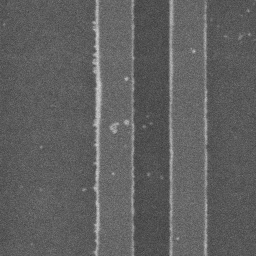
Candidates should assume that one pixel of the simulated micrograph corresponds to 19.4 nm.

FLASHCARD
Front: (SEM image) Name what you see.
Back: lines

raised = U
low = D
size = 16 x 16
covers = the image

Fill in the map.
DDDDDDUUDDDUUDDD
DDDDDDUUDDDUUDDD
DDDDDDUUDDDUUDDD
DDDDDDUUDDDUUDDD
DDDDDDUUDDDUUDDD
DDDDDDUUDDDUUDDD
DDDDDDUUDDDUUDDD
DDDDDDUUDDDUUDDD
DDDDDDUUDDDUUDDD
DDDDDDUUDDDUUDDD
DDDDDDUUDDDUUDDD
DDDDDDUUDDDUUDDD
DDDDDDUUDDDUUDDD
DDDDDDUUDDDUUDDD
DDDDDDUUDDDUUDDD
DDDDDDUUDDDUUDDD